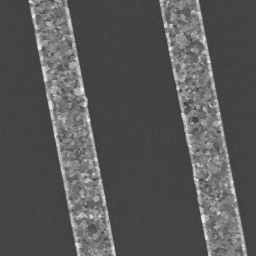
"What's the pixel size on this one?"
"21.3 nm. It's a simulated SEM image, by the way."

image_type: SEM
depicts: one or a few lines or trenches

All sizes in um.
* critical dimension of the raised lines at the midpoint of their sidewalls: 0.744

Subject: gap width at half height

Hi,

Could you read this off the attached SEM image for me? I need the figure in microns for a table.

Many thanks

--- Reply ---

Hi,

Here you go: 2.01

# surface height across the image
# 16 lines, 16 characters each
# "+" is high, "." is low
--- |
..++......++....
..++......+++...
..+++......++...
...++......++...
...++......++...
...++......++...
...++......+++..
...+++......++..
....++......++..
....++......++..
....++......++..
....++......++..
....++......+++.
....+++......++.
.....++......++.
.....++......++.